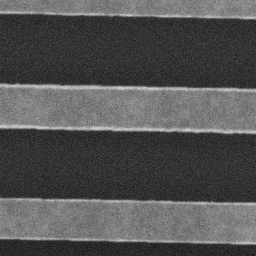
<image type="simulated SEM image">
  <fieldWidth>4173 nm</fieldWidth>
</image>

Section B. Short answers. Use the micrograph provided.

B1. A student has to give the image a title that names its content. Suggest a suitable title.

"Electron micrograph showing lines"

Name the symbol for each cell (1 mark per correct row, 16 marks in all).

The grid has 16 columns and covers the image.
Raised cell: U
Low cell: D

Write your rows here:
UUUUUUUUUUUUUUUU
DDDDDDDDDDDDDDDD
DDDDDDDDDDDDDDDD
DDDDDDDDDDDDDDDD
DDDDDDDDDDDDDDDD
UUUUUUUUUUUUDDDD
UUUUUUUUUUUUUUUU
UUUUUUUUUUUUUUUU
DDDDDDDDDDDDDDDD
DDDDDDDDDDDDDDDD
DDDDDDDDDDDDDDDD
DDDDDDDDDDDDDDDD
UUUUUUUDDDDDDDDD
UUUUUUUUUUUUUUUU
UUUUUUUUUUUUUUUU
DDDDDDDDDDDDDDDD